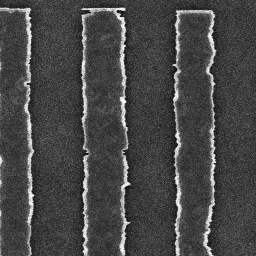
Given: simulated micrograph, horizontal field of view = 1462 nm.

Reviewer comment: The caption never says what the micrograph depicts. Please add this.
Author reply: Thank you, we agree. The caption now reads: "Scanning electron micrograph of one or a few lines or trenches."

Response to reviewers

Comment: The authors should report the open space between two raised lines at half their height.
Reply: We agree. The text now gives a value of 52.7 px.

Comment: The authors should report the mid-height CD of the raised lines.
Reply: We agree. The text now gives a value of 227 nm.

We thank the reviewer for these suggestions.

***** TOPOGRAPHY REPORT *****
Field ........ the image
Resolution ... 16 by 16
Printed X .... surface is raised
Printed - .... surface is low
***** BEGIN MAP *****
----------------
XX---XXX---XX---
XX---XXX---XX---
XX---XXX---XX---
XX---XXX---XX---
XX---XXX---XX---
XX---XXX---XX---
XX---XXX---XX---
XX---XXX---XX---
XX---XXX---XX---
XX---XXX---XX---
XX---XXX---XX---
XX---XXX---XX---
XX---XXX---XX---
XX---XXX---XX---
XX---XXX---XX---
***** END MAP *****